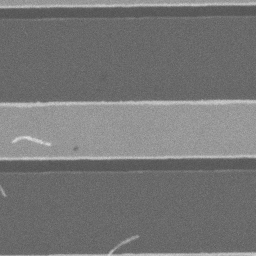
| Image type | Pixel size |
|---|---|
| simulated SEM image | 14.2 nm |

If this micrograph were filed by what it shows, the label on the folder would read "lines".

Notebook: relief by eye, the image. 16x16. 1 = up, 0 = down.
0000000000000000
0000000000000000
0000000000000000
0000000000000000
0000000000000000
0000000000000000
1111111111111111
1111111111111111
1111111111111111
1111111111111111
0000000000000000
0000000000000000
0000000000000000
0000000000000000
0000000000000000
0000000000000000